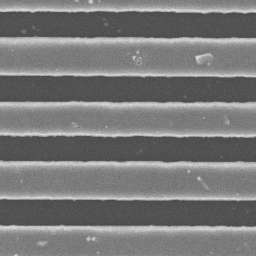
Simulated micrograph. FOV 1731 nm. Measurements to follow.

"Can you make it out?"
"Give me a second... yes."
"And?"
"lines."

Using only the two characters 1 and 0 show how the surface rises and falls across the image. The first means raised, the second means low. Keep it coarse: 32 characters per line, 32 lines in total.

11111111111111111111111111111111
00000000000000000000001011111111
00000000000000000000000000000000
00000000000000000000000000000000
00000000000000000000000000000000
11111111111111111111111111111111
11111111111111111111111111111111
11111111111111111111111111111111
11111111111111111111111111111111
00000000001001100111111111111111
00000000000000000000000000000000
00000000000000000000000000000000
00000000000000000000000000000000
11111111111111111111111111111111
11111111111111111111111111111111
11111111111111111111111111111111
11111111111111111111111111111111
00000000000000000000000000000000
00000000000000000000000000000000
00000000000000000000000000000000
11111111111111111111111111111111
11111111111111111111111111111111
11111111111111111111111111111111
11111111111111111111111111111111
11111111111111111111111111111111
00000000000000000000000000000000
00000000000000000000000000000000
00000000000000000000000000000000
11111111111111111111111111111111
11111111111111111111111111111111
11111111111111111111111111111111
11111111111111111111111111111111